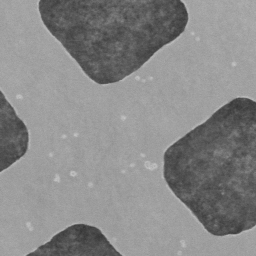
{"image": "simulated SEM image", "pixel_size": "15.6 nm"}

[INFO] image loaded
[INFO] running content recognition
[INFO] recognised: holes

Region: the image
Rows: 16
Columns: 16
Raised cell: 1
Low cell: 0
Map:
1100000000001111
1110000000001111
1111000000011111
1111000000111111
1111100011111111
1111111111111111
0111111111111100
0111111111111000
0011111111100000
0011111111000000
1111111111000000
1111111111000000
1111111111100000
1111111111110000
1111001111111001
1100000111111111